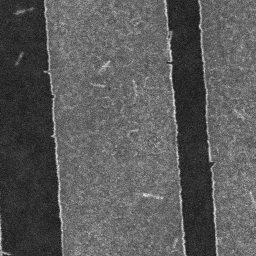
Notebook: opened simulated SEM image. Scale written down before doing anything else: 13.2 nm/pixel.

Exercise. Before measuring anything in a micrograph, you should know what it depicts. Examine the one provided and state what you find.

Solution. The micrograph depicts one or a few lines or trenches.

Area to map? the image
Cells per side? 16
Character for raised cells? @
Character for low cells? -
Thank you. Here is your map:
---@@@@@@@---@@@
---@@@@@@@---@@@
---@@@@@@@@--@@@
---@@@@@@@@--@@@
---@@@@@@@@--@@@
---@@@@@@@@--@@@
---@@@@@@@@--@@@
---@@@@@@@@--@@@
---@@@@@@@@--@@@
----@@@@@@@--@@@
----@@@@@@@--@@@
----@@@@@@@--@@@
----@@@@@@@--@@@
----@@@@@@@--@@@
----@@@@@@@--@@@
----@@@@@@@@--@@